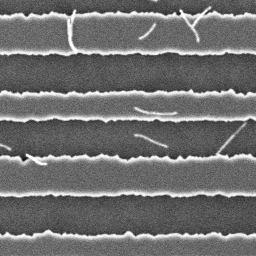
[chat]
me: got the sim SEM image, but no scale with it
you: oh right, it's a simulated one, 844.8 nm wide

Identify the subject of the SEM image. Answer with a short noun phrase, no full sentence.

lines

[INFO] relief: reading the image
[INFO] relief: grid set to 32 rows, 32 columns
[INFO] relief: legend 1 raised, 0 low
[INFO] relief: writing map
00000000000000000000000000000000
00000000000000000000000000000000
11111111111111111111111111111111
11111111111111111111111111111111
11111111111111111111111111111111
11111111111111111111111111111111
11111111111111111111111111111111
00000000000000000000000000000000
00000000000000000000000000000000
00000000000000000000000000000000
00000000000000000000000000000000
10000000000000011101101100101000
11111111111111111111111111111111
11111111111111111111111111111111
11111111111111111111111111111111
00000000000000000000000000000000
00000000000000000000000000000000
00000000000000000000000000000000
00000000000000000000000000000000
00000000001010000000000000010111
11111111111111111111111111111111
11111111111111111111111111111111
11111111111111111111111111111111
11111111111111111111111111111111
10100000000100000000011100000000
00000000000000000000000000000000
00000000000000000000000000000000
00000000000000000000000000000000
00000000000000000000000000000000
11111111111011111111111111111111
11111111111111111111111111111111
11111111111111111111111111111111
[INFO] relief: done